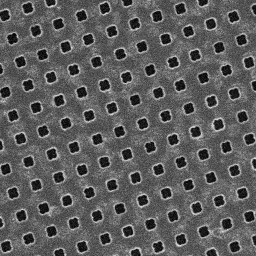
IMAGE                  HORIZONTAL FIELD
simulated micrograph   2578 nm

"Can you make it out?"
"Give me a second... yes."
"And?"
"a regular array of holes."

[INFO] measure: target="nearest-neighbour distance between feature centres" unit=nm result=239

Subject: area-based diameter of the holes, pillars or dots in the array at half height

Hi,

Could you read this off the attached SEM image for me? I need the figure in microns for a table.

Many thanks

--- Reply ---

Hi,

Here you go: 0.111